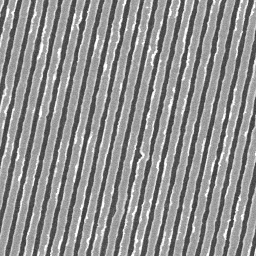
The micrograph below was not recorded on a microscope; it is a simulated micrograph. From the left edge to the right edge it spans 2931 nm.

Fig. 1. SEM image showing parallel lines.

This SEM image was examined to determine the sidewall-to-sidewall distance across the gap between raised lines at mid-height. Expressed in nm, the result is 54.6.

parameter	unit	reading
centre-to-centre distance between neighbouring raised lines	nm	152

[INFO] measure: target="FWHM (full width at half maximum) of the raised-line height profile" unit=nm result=98